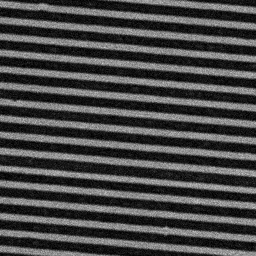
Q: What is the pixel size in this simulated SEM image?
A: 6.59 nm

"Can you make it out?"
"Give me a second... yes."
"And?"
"parallel lines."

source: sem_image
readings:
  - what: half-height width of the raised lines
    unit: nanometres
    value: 37.7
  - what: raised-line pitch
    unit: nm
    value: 107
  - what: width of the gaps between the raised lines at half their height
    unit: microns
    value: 0.0705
